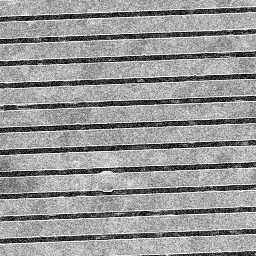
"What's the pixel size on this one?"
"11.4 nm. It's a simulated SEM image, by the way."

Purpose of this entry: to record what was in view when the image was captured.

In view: parallel lines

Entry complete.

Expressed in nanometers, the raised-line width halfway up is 181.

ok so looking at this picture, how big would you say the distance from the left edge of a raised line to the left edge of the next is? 254 nanometres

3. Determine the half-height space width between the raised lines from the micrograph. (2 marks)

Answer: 6.24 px